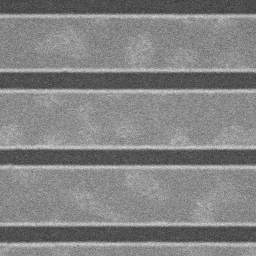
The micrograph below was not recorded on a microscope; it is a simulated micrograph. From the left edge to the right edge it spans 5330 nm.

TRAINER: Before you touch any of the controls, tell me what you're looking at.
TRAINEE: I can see one or a few lines or trenches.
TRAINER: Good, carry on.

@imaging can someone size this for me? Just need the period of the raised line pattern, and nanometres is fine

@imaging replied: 1590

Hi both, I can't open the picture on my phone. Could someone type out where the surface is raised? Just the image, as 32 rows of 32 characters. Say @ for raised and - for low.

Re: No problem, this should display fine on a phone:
--------------------------------
--------------------------------
@@@@@@@@@@@@@@@@@@@@@@@@@@@@@@@@
@@@@@@@@@@@@@@@@@@@@@@@@@@@@@@@@
@@@@@@@@@@@@@@@@@@@@@@@@@@@@@@@@
@@@@@@@@@@@@@@@@@@@@@@@@@@@@@@@@
@@@@@@@@@@@@@@@@@@@@@@@@@@@@@@@@
@@@@@@@@@@@@@@@@@@@@@@@@@@@@@@@@
@@@@@@@@@@@@@@@@@@@@@@@@@@@@@@@@
--------------------------------
--------------------------------
@@@@@@@@@@@--@@@@@@@-@@@@@@@@@@@
@@@@@@@@@@@@@@@@@@@@@@@@@@@@@@@@
@@@@@@@@@@@@@@@@@@@@@@@@@@@@@@@@
@@@@@@@@@@@@@@@@@@@@@@@@@@@@@@@@
@@@@@@@@@@@@@@@@@@@@@@@@@@@@@@@@
@@@@@@@@@@@@@@@@@@@@@@@@@@@@@@@@
@@@@@@@@@@@@@@@@@@@@@@@@@@@@@@@@
--------------------------------
--------------------------------
--------------------------------
@@@@@@@@@@@@@@@@@@@@@@@@@@@@@@@@
@@@@@@@@@@@@@@@@@@@@@@@@@@@@@@@@
@@@@@@@@@@@@@@@@@@@@@@@@@@@@@@@@
@@@@@@@@@@@@@@@@@@@@@@@@@@@@@@@@
@@@@@@@@@@@@@@@@@@@@@@@@@@@@@@@@
@@@@@@@@@@@@@@@@@@@@@@@@@@@@@@@@
@@@@@@@@@@@@@@@@@@@@@@@@@@@@@@@@
--------------------------------
--------------------------------
------------------@-------------
@@@@@@@@@@@@@@@@@@@@@@@@@@@@@@@@